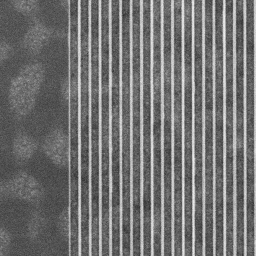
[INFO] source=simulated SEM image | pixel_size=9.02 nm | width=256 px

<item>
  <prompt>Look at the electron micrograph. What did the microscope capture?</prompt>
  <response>parallel lines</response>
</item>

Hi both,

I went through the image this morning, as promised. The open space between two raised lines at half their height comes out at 75.6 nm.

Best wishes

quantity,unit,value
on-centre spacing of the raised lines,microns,0.0934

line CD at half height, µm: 0.0192